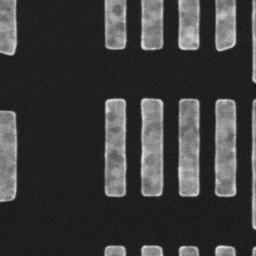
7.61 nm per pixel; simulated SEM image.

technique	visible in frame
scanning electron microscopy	wiring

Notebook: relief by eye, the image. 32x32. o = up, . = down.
oo...........ooo..oo..ooo..oo...
oo...........ooo..oo..ooo..oo...
oo...........ooo..oo..ooo..oo...
oo...........ooo..oo..ooo..oo...
oo...........ooo..oo..ooo..oo...
oo...........ooo..oo..ooo..oo...
oo..............................
................................
................................
................................
................................
................................
..............o...oo...o...oo...
.............ooo..oo..ooo..oo...
oo...........ooo..oo..ooo..oo...
oo...........ooo..oo..ooo..oo...
oo...........ooo..oo..ooo..oo...
oo...........ooo..oo..ooo..oo...
oo...........ooo..oo..ooo..oo...
oo...........ooo..oo..ooo..oo...
oo...........ooo..oo..ooo..oo...
oo...........ooo..oo..ooo..oo...
oo...........ooo..oo..ooo..oo...
oo...........ooo..oo..ooo..oo...
oo..............................
................................
................................
................................
................................
................................
................................
.............ooo..oo..ooo..oo...